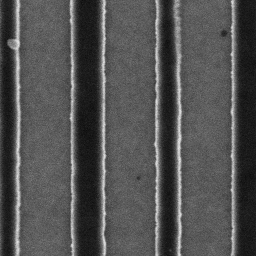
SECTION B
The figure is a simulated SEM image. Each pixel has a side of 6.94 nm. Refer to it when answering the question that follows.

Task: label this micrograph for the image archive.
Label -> lines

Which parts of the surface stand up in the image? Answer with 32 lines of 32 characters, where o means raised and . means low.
oo.......oooo.......oo.......ooo
oo.......oooo.......oo.......ooo
oo.......oooo.......oo.......ooo
oo.......oooo.......oo.......ooo
oo.......oooo.......oo.......ooo
oo.......oooo.......oo.......ooo
oo.......oooo.......oo.......ooo
oo.......oooo.......oo.......ooo
oo.......oooo.......oo.......ooo
oo.......oooo.......oo.......ooo
oo.......oooo.......oo.......ooo
oo.......oooo.......oo.......ooo
oo.......oooo.......oo.......ooo
oo.......oooo.......ooo......ooo
oo.......oooo.......ooo......ooo
oo.......oooo.......oo.......ooo
oo.......oooo.......oo.......ooo
oo.......oooo......ooo.......ooo
oo.......oooo.......oo.......ooo
oo.......oooo.......oo.......ooo
oo.......oooo.......oo.......ooo
oo.......oooo.......oo.......ooo
oo.......oooo.......oo.......ooo
oo.......oooo.......ooo......ooo
oo.......oooo.......oo.......ooo
oo.......oooo.......oo.......ooo
oo.......oooo.......ooo......ooo
oo.......oooo.......oo.......ooo
oo.......oooo.......ooo......ooo
oo.......oooo.......oo.......ooo
oo.......oooo.......oo.......ooo
oo.......oooo.......oo.......ooo